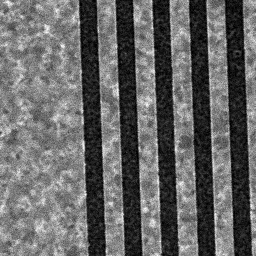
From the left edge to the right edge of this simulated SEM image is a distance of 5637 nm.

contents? parallel lines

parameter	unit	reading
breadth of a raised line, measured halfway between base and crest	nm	390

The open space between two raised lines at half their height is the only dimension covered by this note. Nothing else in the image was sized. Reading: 18.5 pixels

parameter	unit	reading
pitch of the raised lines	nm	807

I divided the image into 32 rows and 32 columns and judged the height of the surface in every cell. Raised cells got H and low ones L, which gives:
HHHHHHHHHHLLHHLLLHHLLHHHLLHHLLHH
HHHHHHHHHHLLHHLLLHHLLHHHLLHHLLHH
HHHHHHHHHHLLHHLLLHHLLHHHLLHHLLLH
HHHHHHHHHHLLHHLLLHHLLHHHLLHHLLLH
HHHHHHHHHHLLHHHLLHHLLHHHLLHHLLLH
HHHHHHHHHHLLHHHLLHHLLLHHLLHHLLLH
HHHHHHHHHHLLHHHLLHHLLLHHLLHHLLLH
HHHHHHHHHHLLHHHLLHHLLLHHLLHHLLLH
HHHHHHHHHHLLHHHLLHHLLLHHLLHHLLLH
HHHHHHHHHHLLLHHLLHHLLLHHLLHHLLLH
HHHHHHHHHHLLLHHLLHHLLLHHLLHHLLLH
HHHHHHHHHHLLLHHLLHHLLLHHLLHHLLLH
HHHHHHHHHHLLLHHLLHHLLLHHLLHHLLLH
HHHHHHHHHHLLLHHLLHHLLLHHLLHHHLLH
HHHHHHHHHHLLLHHLLHHLLLHHLLHHHLLH
HHHHHHHHHHLLLHHLLHHLLLHHLLHHHLLH
HHHHHHHHHHLLLHHLLHHHLLHHLLLHHLLH
HHHHHHHHHHLLLHHLLHHHLLHHLLLHHLLH
HHHHHHHHHHLLLHHLLHHHLLHHLLLHHLLH
HHHHHHHHHHLLLHHLLHHHLLHHLLLHHLLH
HHHHHHHHHHHLLHHLLHHHLLHHLLLHHLLH
HHHHHHHHHHHLLHHLLHHHLLHHLLLHHLLH
HHHHHHHHHHHLLHHLLLHHLLHHLLLHHLLH
HHHHHHHHHHHLLHHLLLHHLLHHLLLHHLLH
HHHHHHHHHHHLLHHLLLHHLLHHLLLHHLLH
HHHHHHHHHHHLLHHLLLHHLLHHLLLHHLLH
HHHHHHHHHHHLLHHLLLHHLLHHLLLHHLLH
HHHHHHHHHHHLLHHLLLHHLLHHHLLHHLLH
HHHHHHHHHHHLLHHLLLHHLLHHHLLHHLLH
HHHHHHHHHHHLLHHLLLHHLLHHHLLHHLLL
HHHHHHHHHHHLLHHLLLHHLLHHHLLHHLLL
HHHHHHHHHHHLLHHHLLHHLLHHHLLHHLLL